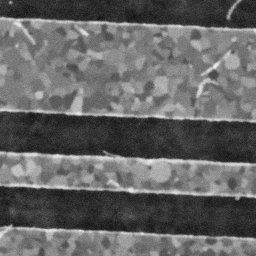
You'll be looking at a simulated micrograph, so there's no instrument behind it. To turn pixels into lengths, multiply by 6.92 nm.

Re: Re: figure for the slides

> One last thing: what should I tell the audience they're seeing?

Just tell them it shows lines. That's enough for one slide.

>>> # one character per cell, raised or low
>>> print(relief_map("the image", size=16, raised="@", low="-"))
----------------
@@@@@@@@@-------
@@@@@@@@@@@@@@@@
@@@@@@@@@@@@@@@@
@@@@@@@@@@@@@@@@
@@@@@@@@@@@@@@@@
@@@@@@@@@@@@@@@@
-------------@@@
----------------
----------------
@@@@@@@@@@@@@@@@
@@@@@@@@@@@@@@@@
----------------
----------------
@@@@@@@---------
@@@@@@@@@@@@@@@@